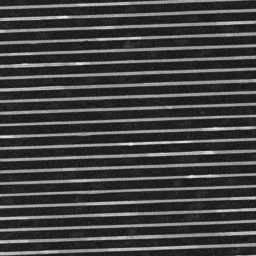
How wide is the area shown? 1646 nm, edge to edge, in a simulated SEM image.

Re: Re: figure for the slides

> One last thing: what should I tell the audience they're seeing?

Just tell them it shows parallel lines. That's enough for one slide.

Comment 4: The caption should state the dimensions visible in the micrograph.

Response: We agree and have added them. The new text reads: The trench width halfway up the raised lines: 61.1 nm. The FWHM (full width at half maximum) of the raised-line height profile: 15.3 nm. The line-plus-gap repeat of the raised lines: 75.3 nm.